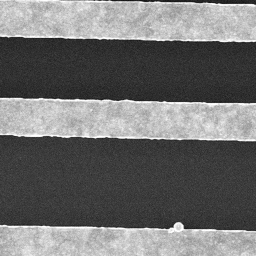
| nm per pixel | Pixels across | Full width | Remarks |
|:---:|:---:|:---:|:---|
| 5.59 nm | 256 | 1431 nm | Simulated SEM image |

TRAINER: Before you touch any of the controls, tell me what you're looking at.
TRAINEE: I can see lines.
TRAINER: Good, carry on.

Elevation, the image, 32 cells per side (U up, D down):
UUUUUUUUUUUUUUUUUUUUUUUUUUUUDDDD
UUUUUUUUUUUUUUUUUUUUUUUUUUUUUUUU
UUUUUUUUUUUUUUUUUUUUUUUUUUUUUUUU
UUUUUUUUUUUUUUUUUUUUUUUUUUUUUUUU
UUUUUUUUUUUUUUUUUUUUUUUUUUUUUUUU
DDDDDDDDDDDDDDDDDDDDDDDDDDDDDDDD
DDDDDDDDDDDDDDDDDDDDDDDDDDDDDDDD
DDDDDDDDDDDDDDDDDDDDDDDDDDDDDDDD
DDDDDDDDDDDDDDDDDDDDDDDDDDDDDDDD
DDDDDDDDDDDDDDDDDDDDDDDDDDDDDDDD
DDDDDDDDDDDDDDDDDDDDDDDDDDDDDDDD
DDDDDDDDDDDDDDDDDDDDDDDDDDDDDDDD
UUUUUUUUDUDDDDDDDDDDDDDDDDDDDDDD
UUUUUUUUUUUUUUUUUUUUUUUUUUUUUUUU
UUUUUUUUUUUUUUUUUUUUUUUUUUUUUUUU
UUUUUUUUUUUUUUUUUUUUUUUUUUUUUUUU
UUUUUUUUUUUUUUUUUUUUUUUUUUUUUUUU
DDDDDDDDDDDDDDDDDDDDDDDDDDDDDUUU
DDDDDDDDDDDDDDDDDDDDDDDDDDDDDDDD
DDDDDDDDDDDDDDDDDDDDDDDDDDDDDDDD
DDDDDDDDDDDDDDDDDDDDDDDDDDDDDDDD
DDDDDDDDDDDDDDDDDDDDDDDDDDDDDDDD
DDDDDDDDDDDDDDDDDDDDDDDDDDDDDDDD
DDDDDDDDDDDDDDDDDDDDDDDDDDDDDDDD
DDDDDDDDDDDDDDDDDDDDDDDDDDDDDDDD
DDDDDDDDDDDDDDDDDDDDDDDDDDDDDDDD
DDDDDDDDDDDDDDDDDDDDDDDDDDDDDDDD
DDDDDDDDDDDDDDDDDDDDDDDDDDDDDDDD
UUUUUUUUUUUUUDDDDDDDDUUDDDDDDDDD
UUUUUUUUUUUUUUUUUUUUUUUUUUUUUUUU
UUUUUUUUUUUUUUUUUUUUUUUUUUUUUUUU
UUUUUUUUUUUUUUUUUUUUUUUUUUUUUUUU